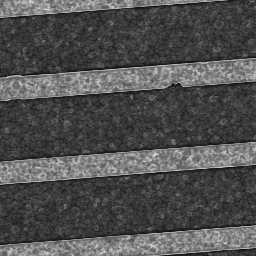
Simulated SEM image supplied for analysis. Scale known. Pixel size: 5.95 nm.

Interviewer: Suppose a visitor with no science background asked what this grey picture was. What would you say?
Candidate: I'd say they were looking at one or a few lines or trenches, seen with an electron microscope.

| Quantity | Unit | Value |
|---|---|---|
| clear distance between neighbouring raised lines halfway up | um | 0.359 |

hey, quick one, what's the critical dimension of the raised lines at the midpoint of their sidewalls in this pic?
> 0.136 micrometres